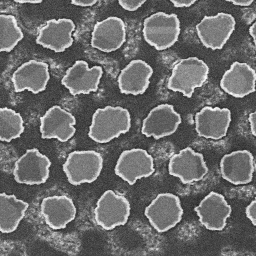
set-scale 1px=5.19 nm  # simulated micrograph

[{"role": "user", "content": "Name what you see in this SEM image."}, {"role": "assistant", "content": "a regular array of raised bodies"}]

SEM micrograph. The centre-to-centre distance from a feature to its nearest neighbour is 260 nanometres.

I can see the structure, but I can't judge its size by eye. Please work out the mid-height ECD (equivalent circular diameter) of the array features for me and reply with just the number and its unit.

173 nanometres